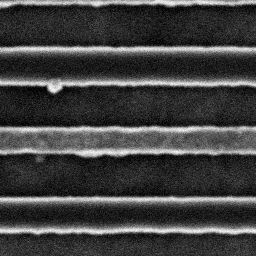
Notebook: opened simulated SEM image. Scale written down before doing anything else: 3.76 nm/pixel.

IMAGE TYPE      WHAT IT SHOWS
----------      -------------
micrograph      lines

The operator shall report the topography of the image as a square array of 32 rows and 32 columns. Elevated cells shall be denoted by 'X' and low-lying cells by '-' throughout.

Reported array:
-----------------------------X--
--------------------------------
--------------------------------
--------------------------------
--------------------------------
--------------------------------
XXXXXXXXXXXXXXXXXXXXXXXXXXXXXXXX
XXXXXXXXXXXXXXXXXXXXXXXXXXXXXXXX
XXXXXXXXXXXXXXXXXXXXXXXXXXXXXXXX
XXXXXXXXXXXXXXXXXXXXXXXXXXXXXXXX
XXXXXXXXXXXXXXXXXXXXXXXXXXXXXXXX
--------------------------------
--------------------------------
--------------------------------
--------------------------------
--------------------------------
XXXXXXXXXXXXXXXXXXXXXXXXXXXXXXXX
XXXXXXXXXXXXXXXXXXXXXXXXXXXXXXXX
XXXXXXXXXXXXXXXXXXXXXXXXXXXXXXXX
--------------------------------
--------------------------------
--------------------------------
--------------------------------
--------------------------------
--------------------------------
XXXXXXXXXXXXXXXXXXXXXXXXXXXXXXXX
XXXXXXXXXXXXXXXXXXXXXXXXXXXXXXXX
XXXXXXXXXXXXXXXXXXXXXXXXXXXXXXXX
XXXXXXXXXXXXXXXXXXXXXXXXXXXXXXXX
--------------------------------
--------------------------------
--------------------------------